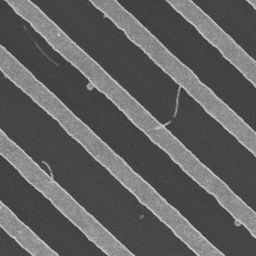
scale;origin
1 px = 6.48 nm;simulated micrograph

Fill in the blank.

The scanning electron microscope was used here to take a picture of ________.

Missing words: lines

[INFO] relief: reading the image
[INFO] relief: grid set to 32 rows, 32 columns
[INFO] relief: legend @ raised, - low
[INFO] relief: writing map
-@@@--------@@@------@@@-------@
--@@@--------@@@------@@@-------
---@@@--------@@@------@@@@-----
----@@@--------@@@------@@@@----
-----@@@--------@@@------@@@@---
------@@@@-------@@@------@@@@--
@------@@@@-------@@@-------@@@-
@@------@@@@-------@@@------@@@@
@@@-------@@@-------@@@@------@@
-@@@-------@@@-------@@@@------@
--@@@------@@@@-------@@@-------
---@@@-------@@@-------@@@@-----
----@@@-------@@@-------@@@@----
-----@@@-------@@@-------@@@@---
------@@@-------@@@-------@@@@--
-------@@@@------@@@--------@@@-
--------@@@@------@@@--------@@@
@--------@@@@------@@@--------@@
@@@--------@@@------@@@--------@
@@@@-------@@@@------@@@--------
-@@@@--------@@@------@@@-------
--@@@@--------@@@------@@@@-----
---@@@@--------@@@------@@@@----
----@@@@--------@@@------@@@@---
------@@@--------@@@-------@@@--
-------@@@--------@@@------@@@@-
@@------@@@--------@@@-------@@@
@@-------@@@--------@@@-------@@
@@@@------@@@--------@@@-------@
-@@@@------@@@--------@@@-------
--@@@@------@@@--------@@@------
----@@@------@@@--------@@@@----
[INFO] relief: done